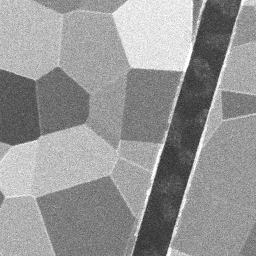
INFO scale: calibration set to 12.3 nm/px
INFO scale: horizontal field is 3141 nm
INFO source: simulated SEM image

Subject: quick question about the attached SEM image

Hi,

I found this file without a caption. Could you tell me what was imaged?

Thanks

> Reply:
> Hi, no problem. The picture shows one or a few lines or trenches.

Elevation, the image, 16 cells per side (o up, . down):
ooooooooooooo..o
oooooooooooo...o
oooooooooooo..oo
oooooooooooo..oo
oooooooooooo..oo
ooooooooooo...oo
ooooooooooo..ooo
ooooooooooo..ooo
oooooooooo...ooo
oooooooooo..oooo
oooooooooo..oooo
ooooooooo...oooo
ooooooooo..ooooo
ooooooooo..ooooo
ooooooooo..ooooo
oooooooo...ooooo